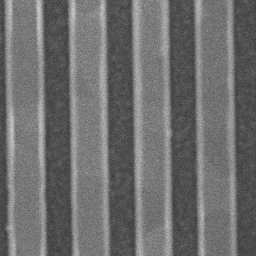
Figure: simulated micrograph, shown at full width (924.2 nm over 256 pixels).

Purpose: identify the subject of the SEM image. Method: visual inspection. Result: one or a few lines or trenches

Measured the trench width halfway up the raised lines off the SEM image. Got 0.102 microns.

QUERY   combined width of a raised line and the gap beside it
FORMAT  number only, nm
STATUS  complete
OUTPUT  228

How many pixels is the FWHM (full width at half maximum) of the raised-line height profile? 35.1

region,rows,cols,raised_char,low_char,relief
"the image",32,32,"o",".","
.oooo....oooo....oooo....oooo...
.oooo....oooo....oooo....oooo...
.oooo....oooo....oooo....oooo...
.oooo....oooo....oooo....oooo...
.oooo....oooo....oooo....oooo...
.oooo....oooo....oooo....oooo...
.oooo....oooo....oooo....oooo...
.oooo....oooo....oooo....oooo...
.oooo....oooo....oooo....oooo...
.oooo....oooo....oooo....oooo...
.oooo....oooo....oooo....oooo...
.oooo....oooo....oooo....oooo...
.oooo....oooo....oooo....oooo...
.oooo....oooo....oooo....oooo...
.oooo....oooo....oooo....oooo...
.oooo....oooo....oooo....oooo...
.oooo....oooo....oooo....oooo...
.oooo....oooo....oooo....oooo...
.oooo....oooo....oooo....oooo...
.oooo....oooo....oooo....oooo...
.oooo....oooo....oooo....oooo...
.oooo....oooo....oooo....oooo...
.ooooo...oooo....oooo....oooo...
.ooooo...oooo....oooo....oooo...
.oooo....oooo....oooo....oooo...
.ooooo...oooo....oooo....oooo...
.ooooo...oooo....oooo....oooo...
.ooooo...oooo....oooo....oooo...
.ooooo...ooooo...oooo....oooo...
.ooooo...ooooo...oooo....oooo...
.ooooo...ooooo...oooo....oooo...
.ooooo...ooooo...oooo....oooo...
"